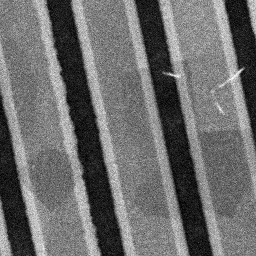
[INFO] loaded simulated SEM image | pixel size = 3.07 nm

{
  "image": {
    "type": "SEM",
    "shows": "one or a few lines or trenches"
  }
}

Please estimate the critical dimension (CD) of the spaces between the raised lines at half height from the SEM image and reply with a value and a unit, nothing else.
106 nanometers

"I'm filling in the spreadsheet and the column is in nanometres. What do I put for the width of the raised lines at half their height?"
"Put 158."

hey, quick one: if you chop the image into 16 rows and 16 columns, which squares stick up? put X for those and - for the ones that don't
XXX--XXX--XXXX--
XXX--XXX---XXX--
XXX--XXXX--XXX--
XXX---XXX--XXX--
XXX---XXX--XXXX-
XXXX--XXX--XXXX-
-XXX--XXX---XXX-
-XXX--XXXX--XXX-
-XXX---XXX--XXX-
-XXX---XXX--XXXX
-XXXX--XXX---XXX
--XXX--XXXX--XXX
--XXX--XXXX--XXX
--XXX---XXX--XXX
--XXXX--XXX--XXX
---XXX--XXX---XX